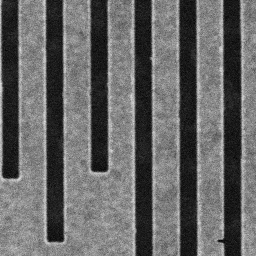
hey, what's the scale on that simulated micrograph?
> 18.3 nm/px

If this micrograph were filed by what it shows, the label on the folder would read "parallel lines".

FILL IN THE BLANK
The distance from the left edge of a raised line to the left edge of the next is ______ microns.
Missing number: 0.815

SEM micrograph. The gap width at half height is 20.5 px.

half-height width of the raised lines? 24.1 pixels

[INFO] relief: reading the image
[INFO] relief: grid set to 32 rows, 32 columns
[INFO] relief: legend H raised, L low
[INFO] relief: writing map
LLLHHHLLHHHLLLHHHLLHHHLLLHHHLLHH
LLLHHLLLHHHLLLHHHLLHHHLLLHHHLLHH
LLLHHHLLHHHLLLHHHLLHHHLLLHHHLLHH
LLHHHLLLHHHLLLHHHLLHHHLLLHHHLLHH
LLLHHHLLHHHLLLHHHLLHHHLLLHHHLLHH
LLLHHHLLHHHLLLHHHLLHHHLLLHHHLLHH
LLLHHHLLHHHLLLHHHLLHHHLLLHHHLLHH
LLLHHLLLHHHLLLHHHLLHHHLLLHHHLLHH
LLLHHLLLHHHLLLHHHLLHHHLLLHHHLLHH
LLLHHLLLHHHLLLHHHLLHHHLLLHHHLLHH
LLLHHLLLHHHLLLHHHLLHHHLLLHHHLLHH
LLLHHLLLHHHLLLHHHLLHHHLLLHHHLLHH
LLLHHLLLHHHLLLHHHLLHHHLLLHHHLLHH
LLLHHHLLHHHLLLHHHLLHHHLLLHHHLLHH
LLLHHHLLHHHLLLHHHLLHHHLLLHHHLLHH
LLLHHHLLHHHLLLHHHLLHHHLLLHHHLLHH
LLLHHHLLHHHLLLHHHLLHHHLLLHHHLLHH
LLLHHHLLHHHLLLHHHLLHHHLLLHHHLLHH
LLLHHHLLHHHLLLHHHLLHHHLLLHHHLLHH
LLLHHHLLHHHLLLHHHLLHHHLLLHHHLLHH
LLLHHHLLHHHLLLHHHLLHHHLLLHHHLLHH
LLLHHHLLHHHLLHHHHLLHHHLLLHHHLLHH
HLHHHHLLHHHHHHHHHLLHHHLLLHHHLLHH
HHHHHHLLHHHHHHHHHLLHHHLLLHHHLLHH
HHHHHHLLHHHHHHHHHLLHHHLLLHHHLLHH
HHHHHHLLHHHHHHHHHLLHHHLLLHHHLLHH
HHHHHHLLHHHHHHHHHLLHHHLLLHHHLLHH
HHHHHHLLHHHHHHHHHLLHHHLLLHHHLLHH
HHHHHHLLHHHHHHHHHLLHHHLLLHHHLLHH
HHHHHHLLHHHHHHHHHLLHHHLLLHHHLLHH
HHHHHHLHHHHHHHHHHLLHHHLLLHHHLLHH
HHHHHHHHHHHHHHHHHLLHHHLLLHHHLLHH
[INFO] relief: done